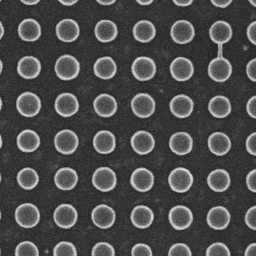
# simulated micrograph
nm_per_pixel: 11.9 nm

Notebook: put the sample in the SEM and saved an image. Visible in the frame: a regular array of raised bodies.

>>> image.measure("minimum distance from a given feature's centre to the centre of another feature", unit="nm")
441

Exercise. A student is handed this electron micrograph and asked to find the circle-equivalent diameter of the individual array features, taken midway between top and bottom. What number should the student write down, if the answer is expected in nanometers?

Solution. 266